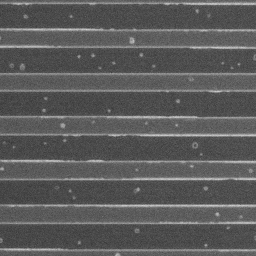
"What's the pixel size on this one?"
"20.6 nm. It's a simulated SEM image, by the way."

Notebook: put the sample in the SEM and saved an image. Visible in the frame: lines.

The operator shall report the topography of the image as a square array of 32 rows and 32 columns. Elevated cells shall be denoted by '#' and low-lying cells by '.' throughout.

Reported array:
........................########
................................
................................
................................
################################
################################
................................
................................
................................
################################
################################
................................
................................
................................
................................
################################
################################
................................
................................
................................
################################
################################
................................
................................
................................
................................
################################
################################
................................
................................
................................
################################